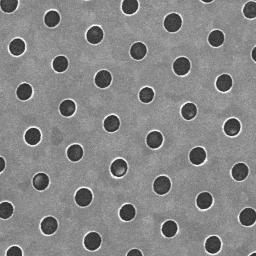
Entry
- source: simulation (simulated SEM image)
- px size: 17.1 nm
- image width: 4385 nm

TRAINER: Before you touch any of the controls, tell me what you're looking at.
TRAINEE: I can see a regular array of holes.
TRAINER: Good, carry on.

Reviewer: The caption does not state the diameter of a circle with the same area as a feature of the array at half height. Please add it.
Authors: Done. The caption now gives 298 nm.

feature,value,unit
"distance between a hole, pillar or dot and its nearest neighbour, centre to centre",767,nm